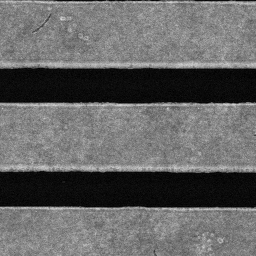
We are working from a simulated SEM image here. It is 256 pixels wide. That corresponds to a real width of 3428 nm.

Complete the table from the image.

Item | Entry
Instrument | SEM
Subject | lines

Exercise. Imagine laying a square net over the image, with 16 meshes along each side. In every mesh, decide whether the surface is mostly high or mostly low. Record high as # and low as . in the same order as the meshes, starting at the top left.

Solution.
################
################
################
################
................
................
#.##..#........#
################
################
################
################
................
................
################
################
################